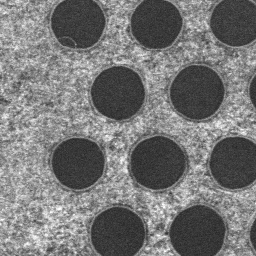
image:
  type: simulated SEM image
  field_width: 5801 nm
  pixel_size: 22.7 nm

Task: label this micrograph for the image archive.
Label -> raised bodies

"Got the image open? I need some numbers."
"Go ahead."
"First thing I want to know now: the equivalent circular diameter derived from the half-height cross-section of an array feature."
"1270 nanometers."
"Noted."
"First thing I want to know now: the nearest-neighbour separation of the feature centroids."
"79.3 pixels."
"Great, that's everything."